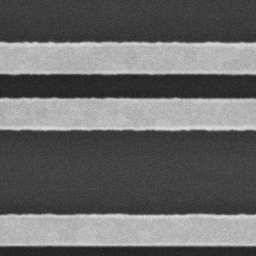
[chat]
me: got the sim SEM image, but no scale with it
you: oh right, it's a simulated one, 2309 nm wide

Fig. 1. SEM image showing lines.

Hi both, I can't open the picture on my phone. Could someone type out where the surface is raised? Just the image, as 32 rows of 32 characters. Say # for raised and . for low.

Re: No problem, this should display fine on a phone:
................................
................................
................................
................................
................................
################################
################################
################################
################################
................................
................................
................................
################################
################################
################################
################################
................................
................................
................................
................................
................................
................................
................................
................................
................................
................................
................................
################################
################################
################################
################################
................................